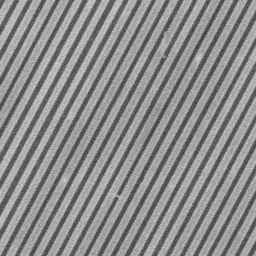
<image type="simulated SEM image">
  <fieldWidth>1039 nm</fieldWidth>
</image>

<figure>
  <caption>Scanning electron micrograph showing parallel lines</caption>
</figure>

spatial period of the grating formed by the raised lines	49.2	nm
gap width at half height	19.3	nanometers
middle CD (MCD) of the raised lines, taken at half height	0.0305	um